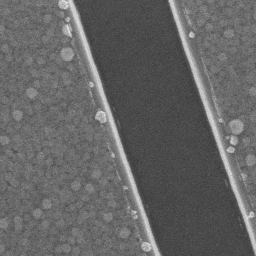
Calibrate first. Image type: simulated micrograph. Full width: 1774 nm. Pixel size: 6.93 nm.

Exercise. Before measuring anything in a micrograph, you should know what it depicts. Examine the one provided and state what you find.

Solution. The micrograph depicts one or a few lines or trenches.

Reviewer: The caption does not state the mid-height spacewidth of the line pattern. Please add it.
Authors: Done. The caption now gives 0.65 microns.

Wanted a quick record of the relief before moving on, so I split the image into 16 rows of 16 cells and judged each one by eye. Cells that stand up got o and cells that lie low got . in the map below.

ooooo......ooooo
ooooo......ooooo
ooooo......ooooo
oooooo......oooo
oooooo......oooo
oooooo......oooo
ooooooo......ooo
ooooooo......ooo
ooooooo.......oo
oooooooo......oo
oooooooo......oo
oooooooo.......o
ooooooooo......o
ooooooooo......o
ooooooooo.......
oooooooooo......